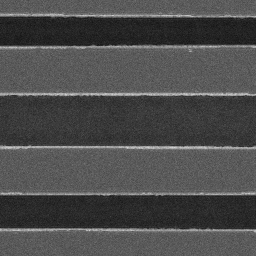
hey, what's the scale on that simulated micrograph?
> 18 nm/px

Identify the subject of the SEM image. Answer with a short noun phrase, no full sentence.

lines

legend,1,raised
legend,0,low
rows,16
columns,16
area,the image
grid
1111111111111111
0000000000000000
0000000000000000
1111111111111111
1111111111111111
1111111111111111
0000000000000000
0000000000000000
0000000000000000
1111111111111111
1111111111111111
1111111111111111
0000000000000000
0000000000000000
1111111111111111
1111111111111111